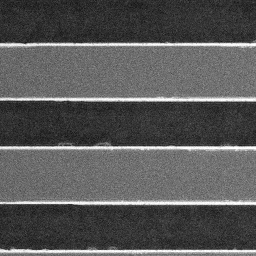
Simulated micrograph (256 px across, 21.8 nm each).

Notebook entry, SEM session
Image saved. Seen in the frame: lines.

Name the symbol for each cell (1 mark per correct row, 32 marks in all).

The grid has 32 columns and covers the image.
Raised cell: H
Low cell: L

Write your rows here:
LLLLLLLLLLLLLLLLLLLLLLLLLLLLLLLL
LLLLLLLLLLLLLLLLLLLLLLLLLLLLLLLL
LLLLLLLLLLLLLLLLLLLLLLLLLLLLLLLL
LLLLLLLLLLLLLLLLLLLLLLLLLLLLLLLL
LLLLLLLLLLLLLLLLLLLLLLLLLLLLLLLL
LLLLLLLLLLLLLHHLHHHHHHLHHHHHHHHH
HHHHHHHHHHHHHHHHHHHHHHHHHHHHHHHH
HHHHHHHHHHHHHHHHHHHHHHHHHHHHHHHH
HHHHHHHHHHHHHHHHHHHHHHHHHHHHHHHH
HHHHHHHHHHHHHHHHHHHHHHHHHHHHHHHH
HHHHHHHHHHHHHHHHHHHHHHHHHHHHHHHH
HHHHHHHHHHHHHHHHHHHHHHHHHHHHHHHH
LLLLLLLLLLLLLLLLHHHHHHHHHHHHHHHH
LLLLLLLLLLLLLLLLLLLLLLLLLLLLLLLL
LLLLLLLLLLLLLLLLLLLLLLLLLLLLLLLL
LLLLLLLLLLLLLLLLLLLLLLLLLLLLLLLL
LLLLLLLLLLLLLLLLLLLLLLLLLLLLLLLL
LLLLLLLLLLLLLLLLLLLLLLLLLLLLLLLL
HHHHHHHHHHHHHHHHHHHHHHHHHHHHHHHH
HHHHHHHHHHHHHHHHHHHHHHHHHHHHHHHH
HHHHHHHHHHHHHHHHHHHHHHHHHHHHHHHH
HHHHHHHHHHHHHHHHHHHHHHHHHHHHHHHH
HHHHHHHHHHHHHHHHHHHHHHHHHHHHHHHH
HHHHHHHHHHHHHHHHHHHHHHHHHHHHHHHH
HHHHHHHHHHHHHHHHHHHHHHHHHHHHHHHH
LLLLLLLLLLLLLLLLHLLLHHHHHHHHHHHH
LLLLLLLLLLLLLLLLLLLLLLLLLLLLLLLL
LLLLLLLLLLLLLLLLLLLLLLLLLLLLLLLL
LLLLLLLLLLLLLLLLLLLLLLLLLLLLLLLL
LLLLLLLLLLLLLLLLLLLLLLLLLLLLLLLL
LLLLLLLLLLLLLLLLLLLLLLLLLLLLLLLL
HHHHHHHHHHHHHHHHHHHHHHHHHHHHHHHH